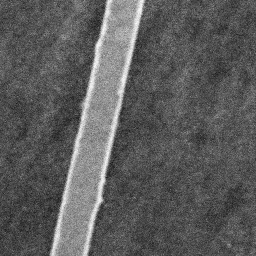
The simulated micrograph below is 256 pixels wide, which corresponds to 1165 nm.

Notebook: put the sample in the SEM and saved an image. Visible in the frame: one or a few lines or trenches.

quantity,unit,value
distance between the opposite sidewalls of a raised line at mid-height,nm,149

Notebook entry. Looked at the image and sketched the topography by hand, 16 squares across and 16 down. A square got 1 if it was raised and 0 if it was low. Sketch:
0000000110000000
0000001110000000
0000001100000000
0000001100000000
0000001100000000
0000001100000000
0000011100000000
0000011000000000
0000011000000000
0000011000000000
0000111000000000
0000110000000000
0000110000000000
0000110000000000
0000110000000000
0001100000000000